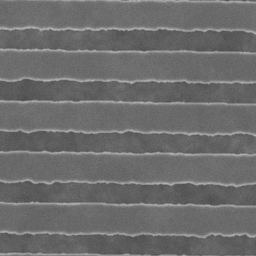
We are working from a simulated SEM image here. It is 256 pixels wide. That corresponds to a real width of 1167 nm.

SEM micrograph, lines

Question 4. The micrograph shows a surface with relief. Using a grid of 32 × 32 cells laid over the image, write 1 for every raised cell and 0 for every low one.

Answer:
11111111111111111111111111111111
11111111111111111111111111111111
11111111111111111111111111111111
11111111111111111111111111111111
00000000000000000000000000000000
00000000000000000000000000000000
11111111111111111111111110010000
11111111111111111111111111111111
11111111111111111111111111111111
11111111111111111111111111111111
00000000000000000000000000000000
00000000000000000000000000000000
00000000000000000000000000000000
11111111111111111111111111111111
11111111111111111111111111111111
11111111111111111111111111111111
00010000011111110111111111111111
00000000000000000000000000000000
00000000000000000000000000000000
11111111111111111111111111111111
11111111111111111111111111111111
11111111111111111111111111111111
11111111111111111111111111111111
00000000000000000000000000000000
00000000000000000000000000000000
11111111111111000100000000000000
11111111111111111111111111111111
11111111111111111111111111111111
11111111111111111111111111111111
00000000000000001000000111001001
00000000000000000000000000000000
00000000000000000000000000000000